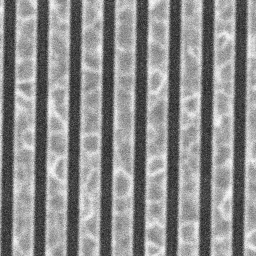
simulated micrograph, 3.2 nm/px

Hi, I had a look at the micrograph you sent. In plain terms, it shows parallel lines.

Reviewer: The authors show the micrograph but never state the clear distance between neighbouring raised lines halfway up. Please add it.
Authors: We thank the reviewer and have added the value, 42.4 nm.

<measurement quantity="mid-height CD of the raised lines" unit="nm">63.6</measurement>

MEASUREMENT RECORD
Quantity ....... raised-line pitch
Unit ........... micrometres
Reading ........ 0.105